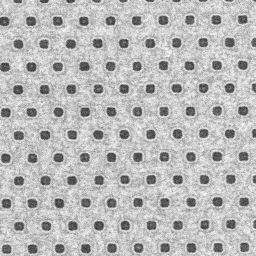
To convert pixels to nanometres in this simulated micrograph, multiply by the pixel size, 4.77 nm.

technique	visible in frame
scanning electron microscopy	a regular array of holes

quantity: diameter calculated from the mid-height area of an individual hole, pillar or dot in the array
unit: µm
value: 0.0519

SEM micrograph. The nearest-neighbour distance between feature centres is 0.124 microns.